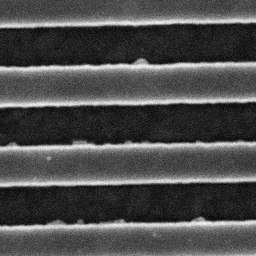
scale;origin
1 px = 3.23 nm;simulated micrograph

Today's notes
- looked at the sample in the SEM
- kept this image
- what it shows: lines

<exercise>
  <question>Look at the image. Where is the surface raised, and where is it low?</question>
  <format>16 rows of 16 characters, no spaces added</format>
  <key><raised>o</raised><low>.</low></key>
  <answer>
oooooooooooooooo
ooooooooooo.....
................
................
oooooooooooooooo
oooooooooooooooo
ooooooo.o.......
................
................
oooooooooooooooo
oooooooooooooooo
ooooooo.........
................
................
oooooooooooooooo
oooooooooooooooo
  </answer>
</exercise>